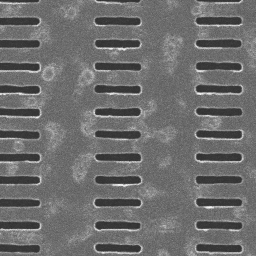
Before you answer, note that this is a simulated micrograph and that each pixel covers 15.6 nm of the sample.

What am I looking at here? a regular array of holes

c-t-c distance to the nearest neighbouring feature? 22.4 px